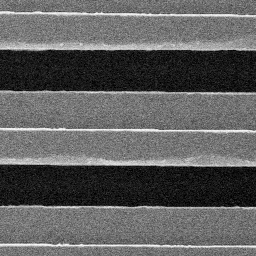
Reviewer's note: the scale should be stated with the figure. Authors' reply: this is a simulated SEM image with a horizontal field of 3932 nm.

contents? lines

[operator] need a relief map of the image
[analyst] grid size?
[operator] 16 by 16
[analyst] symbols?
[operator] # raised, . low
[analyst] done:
################
################
################
................
................
................
################
################
################
################
................
................
................
################
################
################